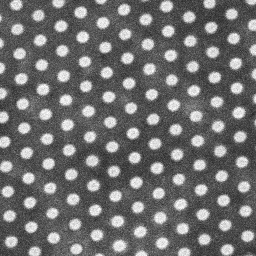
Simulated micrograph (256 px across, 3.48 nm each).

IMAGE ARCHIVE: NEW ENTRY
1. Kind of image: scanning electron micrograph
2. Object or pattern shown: a regular array of raised bodies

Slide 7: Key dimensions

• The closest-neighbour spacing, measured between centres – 0.0847 microns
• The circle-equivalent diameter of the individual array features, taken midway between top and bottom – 0.0365 µm